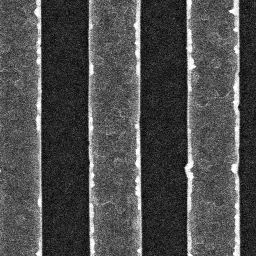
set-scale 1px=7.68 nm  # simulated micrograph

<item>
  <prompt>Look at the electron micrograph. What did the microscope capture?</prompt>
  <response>one or a few lines or trenches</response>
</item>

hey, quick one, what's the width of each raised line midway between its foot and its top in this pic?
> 394 nm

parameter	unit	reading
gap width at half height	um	0.366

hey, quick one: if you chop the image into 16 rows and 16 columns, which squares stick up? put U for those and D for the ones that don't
UUUDDDUUUDDDUUUD
UUUDDDUUUDDDUUUD
UUUDDDUUUDDDUUUD
UUUDDDUUUDDDUUUD
UUUDDDUUUDDDUUUD
UUUDDDUUUDDDUUUD
UUUDDDUUUDDDUUUD
UUUDDDUUUDDDUUUD
UUUDDDUUUDDDUUUD
UUUDDDUUUDDDUUUD
UUUDDDUUUDDDUUUD
UUUDDDUUUDDDUUUD
UUUDDDUUUDDDUUUD
UUUDDDUUUDDDUUUD
UUUDDDUUUDDDUUUD
UUUDDDUUUDDDUUUD